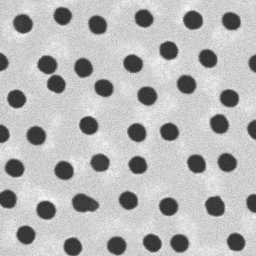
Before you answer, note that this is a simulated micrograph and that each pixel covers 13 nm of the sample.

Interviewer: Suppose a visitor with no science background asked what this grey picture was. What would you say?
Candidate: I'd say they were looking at a regular array of holes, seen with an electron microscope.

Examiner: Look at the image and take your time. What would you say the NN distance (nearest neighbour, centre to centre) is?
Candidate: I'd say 35.2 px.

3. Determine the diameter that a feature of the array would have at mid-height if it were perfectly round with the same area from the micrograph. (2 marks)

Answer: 249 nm